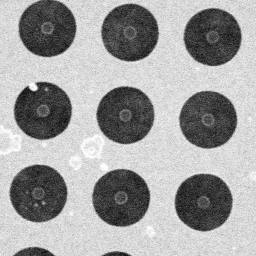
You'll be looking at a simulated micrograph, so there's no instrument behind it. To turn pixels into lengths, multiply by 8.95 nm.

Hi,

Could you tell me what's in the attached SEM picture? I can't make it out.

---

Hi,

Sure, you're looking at an array of small figures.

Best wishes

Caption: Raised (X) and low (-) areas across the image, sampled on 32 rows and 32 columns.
XXXX----XXXXXXX--XXXXXXXXXXXXXXX
XXX------XXXXX-----XXXXXX---XXXX
XX-------XXXX-------XXXX------XX
XX---XX---XXX---X---XXX-------XX
XX-------XXXX---X---XXX---X---XX
XXX------XXXX-------XXX-------XX
XXXX----XXXXX------XXXX-------XX
XXXXXXXXXXXXXXX---XXXXXX-----XXX
XXXXXXXXXXXXXXXXXXXXXXXXXXXXXXXX
XXXXXXXXXXXXXXXXXXXXXXXXXXXXXXXX
XXXXX--XXXXXXXXXXXXXXXXXXXXXXXXX
XXX-----XXXXX-----XXXXXXX--XXXXX
XX-------XXXX------XXXX------XXX
XX---X---XXX-------XXXX------XXX
XX-------XXX---X---XXX--------XX
XX-------XXX-------XXX--------XX
XXX-----XXXXX------XXXX------XXX
XXXXX-XXXXXXXX----XXXXX------XXX
XXXXXXXXXXXXXXXXXXXXXXXXX--XXXXX
XXXXXXXXXXXXXXXXXXXXXXXXXXXXXXXX
XXXXXXXXXXXXXXXXXXXXXXXXXXXXXXXX
XX-----XXXXXX----XXXXXXXXXXXXXXX
XX------XXXX------XXXXX-----XXXX
X-------XXXX-------XXX-------XXX
X---X---XXX---XX---XXX-------XXX
X-------XXXX-------XXX---X---XXX
XX------XXXX------XXXX-------XXX
XXX---XXXXXXX-----XXXX------XXXX
XXXXXXXXXXXXXXXXXXXXXXXX---XXXXX
XXXXXXXXXXXXXXXXXXXXXXXXXXXXXXXX
XXXXXXXXXXXXXXXXXXXXXXXXXXXXXXXX
XX----XXXXXXXX-XXXXXXXXXXXXXXXXX